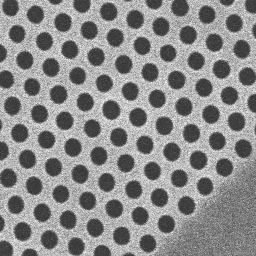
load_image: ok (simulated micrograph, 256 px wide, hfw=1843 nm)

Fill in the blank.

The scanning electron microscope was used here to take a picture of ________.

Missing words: a regular array of holes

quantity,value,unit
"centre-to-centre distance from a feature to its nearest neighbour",192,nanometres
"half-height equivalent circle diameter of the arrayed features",131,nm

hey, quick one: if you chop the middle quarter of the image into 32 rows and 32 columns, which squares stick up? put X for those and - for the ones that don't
XXXXXXXXXXXXX----XXX---XXXXXXXX-
XX---XXXXXXXX----XX-----XXXXXXXX
X----XXXXXXXXX--XXX-----XX----XX
X----XXX----XXXXXXXX---XXX----XX
XX---XXX----XXXX-XXXX-XXXX----XX
XXXXXXXX----XXX---XXXXXXXX----XX
-XXXXXXX----XX-----XXX--XXXXXXXX
-XXX--XXXXXXXX-----XX----XXXXXXX
-XX----XXXXXXXX---XXX-----XXX--X
XXX-----XX---XXXXXXXX----XXX----
XXX----XXX----XXXXXXXX---XXX----
XXXX---XX-----XXX---XXXXXXXX----
--XXXXXXXX----XX-----XXXXXXXX---
--XXXXXXXXX--XXX-----XXX--XXXXXX
--XXX----XXXXXXXX---XXX----XXXXX
--XXX----XXXXXXXXX--XXX----XXX--
XXXXX----XXX---XXXXXXXX----XXX--
XXXXX----XXX----XXXXXXXX--XXXX--
XXXXXXXXXXX-----XXX---XXXXXXXX--
----XXXXXXXX----XX----XXXXXXXXX-
----XXXXXXXXX--XXX----XXX----XXX
----XXX---XXXXXXXX----XXX----XXX
X---XXX----XXXX-XXXX-XXXX----XXX
XXXXXXX----XXX---XXXXXXXX----XX-
XXXXXXX---XXX-----XXX--XXXXXXXX-
XXX--XXXXXXXX-----XX----XXXXXXXX
XX----XXXXXXXX---XXX----XXXX-XXX
XX----XXXX--XXXXXXXX----XXX----X
XX----XXX----XXXXXXXX--XXXX----X
XXX--XXX-----XXX---XXXXXXXX----X
XXXXXXXXX----XX----XXXXXXXXX--XX
-XXXXXXXX---XXX-----XX---XXXXXXX